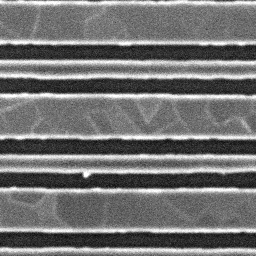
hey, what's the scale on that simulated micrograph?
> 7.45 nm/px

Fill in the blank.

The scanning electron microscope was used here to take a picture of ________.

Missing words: lines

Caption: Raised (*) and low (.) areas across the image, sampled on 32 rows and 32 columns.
********************************
********************************
********************************
********************************
********************************
...............**........****.*.
................................
................................
********************************
********************************
................................
................................
********************************
********************************
********************************
********************************
********************************
................................
................................
....***.**.**...*************...
********************************
.............***..****..........
................................
................................
********************************
********************************
********************************
********************************
********************************
................................
................................
********************************